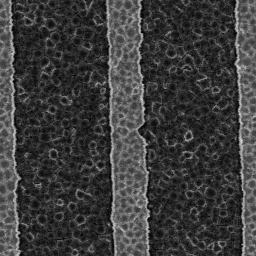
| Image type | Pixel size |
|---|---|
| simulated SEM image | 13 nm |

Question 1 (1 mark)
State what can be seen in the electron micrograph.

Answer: one or a few lines or trenches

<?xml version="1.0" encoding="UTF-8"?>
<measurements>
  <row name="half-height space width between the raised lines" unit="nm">1250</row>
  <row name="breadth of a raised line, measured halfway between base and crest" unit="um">0.417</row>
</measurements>